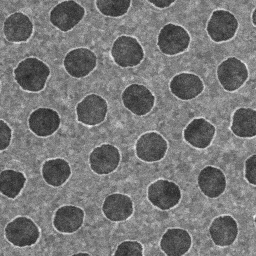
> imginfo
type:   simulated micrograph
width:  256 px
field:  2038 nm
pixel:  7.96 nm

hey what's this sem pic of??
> a regular array of holes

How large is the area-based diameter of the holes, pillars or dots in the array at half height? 0.253 um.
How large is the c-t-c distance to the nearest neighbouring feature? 383 nm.